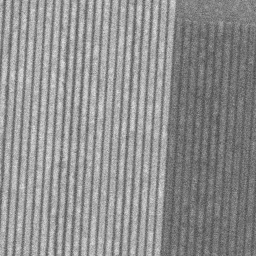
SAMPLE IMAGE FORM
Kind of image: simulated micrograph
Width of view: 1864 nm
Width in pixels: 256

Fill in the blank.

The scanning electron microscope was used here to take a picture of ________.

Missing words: parallel lines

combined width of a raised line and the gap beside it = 59.5 nanometres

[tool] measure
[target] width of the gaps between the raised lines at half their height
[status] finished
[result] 26.3 nm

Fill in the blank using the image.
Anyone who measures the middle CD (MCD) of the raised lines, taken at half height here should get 33.6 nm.